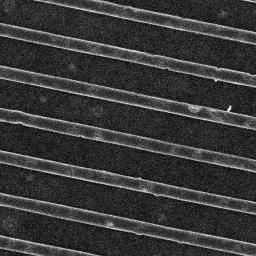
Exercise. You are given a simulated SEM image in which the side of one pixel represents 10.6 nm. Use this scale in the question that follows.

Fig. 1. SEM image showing parallel lines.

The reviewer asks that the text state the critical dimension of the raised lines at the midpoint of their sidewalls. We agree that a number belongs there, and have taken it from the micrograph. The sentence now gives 0.128 µm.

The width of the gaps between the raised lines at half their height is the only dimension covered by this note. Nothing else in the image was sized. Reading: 0.318 µm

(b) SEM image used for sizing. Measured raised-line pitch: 443 nm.